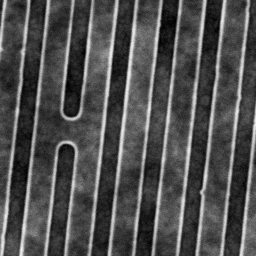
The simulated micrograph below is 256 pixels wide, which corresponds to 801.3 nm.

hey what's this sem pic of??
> parallel lines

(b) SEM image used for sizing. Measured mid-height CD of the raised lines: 0.0798 µm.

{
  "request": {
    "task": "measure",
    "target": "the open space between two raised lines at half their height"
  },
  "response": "0.0553 µm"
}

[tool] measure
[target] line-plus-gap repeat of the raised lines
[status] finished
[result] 0.137 microns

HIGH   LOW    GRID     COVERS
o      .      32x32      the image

.ooo..ooo...ooo..ooo..oooo..ooo.
oooo..ooo..oooo..ooo..oooo..ooo.
ooo...ooo..ooo...ooo..ooo...ooo.
ooo...ooo..ooo...ooo..ooo...ooo.
ooo...ooo..ooo...ooo..ooo..oooo.
ooo..oooo..ooo..oooo..ooo..oooo.
ooo..ooo...ooo..ooo...ooo..oooo.
ooo..ooo...ooo..ooo...ooo..ooo..
ooo..ooo...ooo..ooo...ooo..ooo..
ooo..ooo...ooo..ooo...ooo..ooo..
ooo..ooo..oooo..ooo..oooo..ooo..
ooo..ooo..oooo..ooo..ooo...ooo..
oo...ooo..ooo...ooo..ooo...ooo..
oo...ooo..ooo...ooo..ooo...ooo..
oo..oooo..ooo..oooo..ooo..oooo..
oo..ooooooooo..ooo...ooo..oooo..
oo..ooooooooo..ooo...ooo..ooo...
oo..ooooooooo..ooo...ooo..ooo...
oo..ooo..oooo..ooo...ooo..ooo...
oo..ooo..oooo..ooo..oooo..ooo..o
o...ooo..oooo..ooo..ooo...ooo..o
o...ooo..ooo...ooo..ooo...ooo..o
o...ooo..ooo...ooo..ooo...ooo..o
o..oooo..ooo..oooo..ooo..oooo..o
o..oooo..ooo..oooo..ooo..ooo...o
o..oooo..ooo..ooo...ooo..ooo...o
o..ooo...ooo..ooo...ooo..ooo...o
o..ooo...ooo..ooo..oooo..ooo...o
o..ooo..oooo..ooo..oooo..ooo..oo
...ooo..oooo..ooo..oooo..ooo..oo
...ooo..ooo...ooo..ooo...ooo..oo
...ooo..ooo...ooo..ooo...ooo..oo